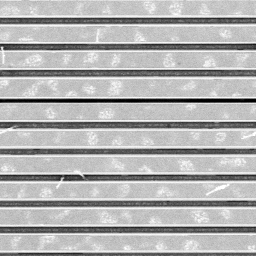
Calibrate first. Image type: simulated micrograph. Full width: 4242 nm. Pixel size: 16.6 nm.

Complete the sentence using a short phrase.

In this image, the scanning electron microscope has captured parallel lines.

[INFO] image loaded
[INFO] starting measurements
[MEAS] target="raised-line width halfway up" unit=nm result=306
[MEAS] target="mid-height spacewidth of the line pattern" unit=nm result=124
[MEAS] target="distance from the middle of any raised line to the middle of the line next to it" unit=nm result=433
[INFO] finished